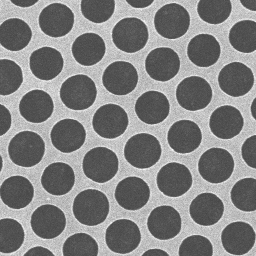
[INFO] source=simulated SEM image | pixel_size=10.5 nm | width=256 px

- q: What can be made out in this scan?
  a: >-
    a regular array of holes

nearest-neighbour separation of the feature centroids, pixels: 43.1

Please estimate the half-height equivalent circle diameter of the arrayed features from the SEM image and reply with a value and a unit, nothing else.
35 pixels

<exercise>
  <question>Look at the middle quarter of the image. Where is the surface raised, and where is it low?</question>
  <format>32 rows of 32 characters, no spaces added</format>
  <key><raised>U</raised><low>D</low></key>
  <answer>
UUUUUUUUUUUDDDDDDUUUDDDDDDDDDUUU
UUUUUUUUUUDDDDDDDDUUDDDDDDDDDUUU
UUUUUUUUUUDDDDDDDDUUUDDDDDDDUUUU
UDDDDDUUUUDDDDDDDDDUUUDDDDDUUUDD
DDDDDDDUUUDDDDDDDDUUUUUUUUUUUDDD
DDDDDDDDUUDDDDDDDDUUUUUUUUUUDDDD
DDDDDDDDUUUDDDDDDUUUUUUUUUUUDDDD
DDDDDDDDUUUUDDDDUUUUDDDDDUUUDDDD
DDDDDDDDUUUUUUUUUUUDDDDDDDUUDDDD
DDDDDDDDUUUUUUUUUUDDDDDDDDUUDDDD
DDDDDDDUUUDDDDUUUUDDDDDDDDUUUDDD
UUUDDUUUDDDDDDDUUUDDDDDDDDUUUUUD
UUUUUUUUDDDDDDDDUUDDDDDDDDUUUUUU
UUUUUUUDDDDDDDDDUUUDDDDDDUUUUUUU
DDDDUUUDDDDDDDDDUUUUDDDDUUUUDDDD
DDDDDUUDDDDDDDDDUUUUUUUUUUUDDDDD
DDDDDUUUDDDDDDDUUUUUUUUUUUDDDDDD
DDDDDDUUDDDDDDDUUUUDDUUUUUDDDDDD
DDDDDUUUUUDDUUUUUDDDDDDUUUDDDDDD
DDDDDUUUUUUUUUUUDDDDDDDDUUDDDDDD
DDDDDUUUUUUUUUUDDDDDDDDDUUDDDDDD
DDDUUUUDDDDDUUUDDDDDDDDDUUUDDDDD
UUUUUUDDDDDDDUUDDDDDDDDDUUUUUUUU
UUUUUDDDDDDDDUUDDDDDDDDDUUUUUUUU
UUUUUDDDDDDDDDUUDDDDDDDUUUUUUUUU
DUUUUDDDDDDDDDUUUDDDDDUUUDDDDDUU
DDUUUDDDDDDDDDUUUUUUUUUUDDDDDDDU
DDDUUDDDDDDDDUUUUUUUUUUDDDDDDDDD
DDDUUUDDDDDDUUUDDDDUUUUDDDDDDDDD
DDDUUUUUDDDUUUDDDDDDUUUDDDDDDDDD
DDUUUUUUUUUUUDDDDDDDDUUDDDDDDDDD
DDUUUUDDUUUUUDDDDDDDDUUUDDDDDDDU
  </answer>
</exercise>